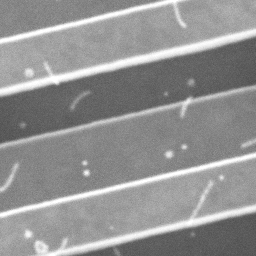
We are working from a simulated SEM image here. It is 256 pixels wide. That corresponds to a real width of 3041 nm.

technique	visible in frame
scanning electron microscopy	lines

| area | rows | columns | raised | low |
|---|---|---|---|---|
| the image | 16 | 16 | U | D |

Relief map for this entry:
UUUUUUUUUUUUUUUU
UUUUUUUUUUUUUUUU
UUUUUUUUUUUUUUDD
UUUUUUUUUUDDDDDD
UUUUUDDDDDDDDDDD
UDDDDDDDDDDDDDDU
DDDDDDDDDDDUUUUU
DDDDDDDUUUUUUUUU
DDUUUUUUUUUUUUUU
UUUUUUUUUUUUUUUU
UUUUUUUUUUUUUUUU
UUUUUUUUUUUUUUUU
UUUUUUUUUUUUUUUU
UUUUUUUUUUUUUUDD
UUUUUUUUUDDDDDDD
UUUUUDDDDDDDDDDD